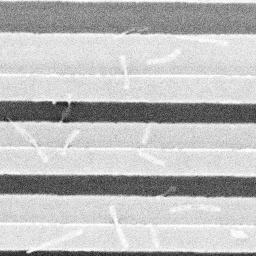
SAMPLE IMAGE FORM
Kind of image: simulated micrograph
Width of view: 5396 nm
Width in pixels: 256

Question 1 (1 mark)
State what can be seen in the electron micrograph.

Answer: lines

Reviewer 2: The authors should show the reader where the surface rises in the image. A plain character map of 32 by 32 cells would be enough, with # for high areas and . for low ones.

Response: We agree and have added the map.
................................
................................
................................
................................
######################..........
################################
################################
################################
################################
################################
################################
################################
....############################
................................
................................
####################............
################################
################################
################################
################################
################################
################################
................................
................................
#######.........................
################################
################################
################################
################################
################################
################################
................................